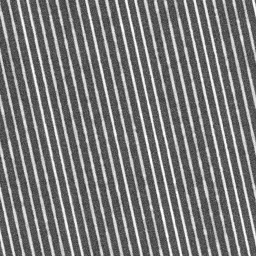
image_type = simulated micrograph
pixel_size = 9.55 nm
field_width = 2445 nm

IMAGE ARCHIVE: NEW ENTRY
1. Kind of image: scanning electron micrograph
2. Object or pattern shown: parallel lines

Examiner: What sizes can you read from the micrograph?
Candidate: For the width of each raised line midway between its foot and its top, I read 18.7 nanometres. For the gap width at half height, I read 74.6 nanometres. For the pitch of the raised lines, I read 91.5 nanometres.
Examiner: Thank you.